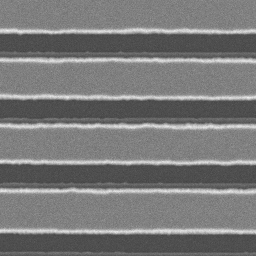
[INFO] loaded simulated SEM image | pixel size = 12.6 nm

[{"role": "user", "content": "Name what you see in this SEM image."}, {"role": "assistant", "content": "lines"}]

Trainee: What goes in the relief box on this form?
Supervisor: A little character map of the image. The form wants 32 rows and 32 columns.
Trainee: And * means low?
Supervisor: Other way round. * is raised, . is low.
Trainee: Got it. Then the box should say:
********************************
********************************
********************************
********************************
................................
................................
................................
********************************
********************************
********************************
********************************
********************************
................................
................................
................................
**..**......*.....*.............
********************************
********************************
********************************
********************************
.........**...***.**.****..*****
................................
................................
................................
********************************
********************************
********************************
********************************
********************************
................................
................................
................................